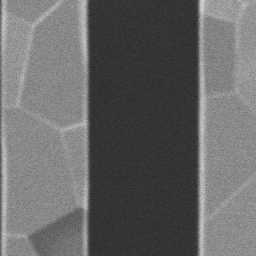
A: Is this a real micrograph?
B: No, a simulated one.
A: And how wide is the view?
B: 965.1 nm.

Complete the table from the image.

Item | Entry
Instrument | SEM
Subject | wiring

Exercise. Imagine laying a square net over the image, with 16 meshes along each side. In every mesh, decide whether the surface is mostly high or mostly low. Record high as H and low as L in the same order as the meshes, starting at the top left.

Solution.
HHHHHLLLLLLLLHHH
HHHHHLLLLLLLLHHH
HHHHHLLLLLLLLHHH
HHHHHLLLLLLLLHHH
HHHHHLLLLLLLLHHH
HHHHHLLLLLLLLHHH
HHHHHLLLLLLLLHHH
HHHHHLLLLLLLLHHH
HHHHHLLLLLLLLHHH
HHHHHLLLLLLLLHHH
HHHHHLLLLLLLLHHH
HHHHHLLLLLLLLHHH
HHHHHLLLLLLLLHHH
HHHHHLLLLLLLLHHH
HHHHHLLLLLLLLHHH
HHHHHLLLLLLLLHHH